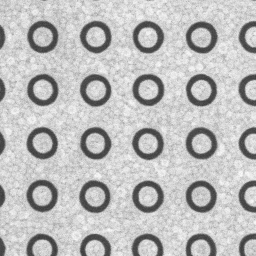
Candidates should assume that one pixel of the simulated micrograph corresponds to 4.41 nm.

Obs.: a regular array of ring-shaped grooves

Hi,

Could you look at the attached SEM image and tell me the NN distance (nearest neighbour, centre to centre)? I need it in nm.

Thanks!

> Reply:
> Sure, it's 232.